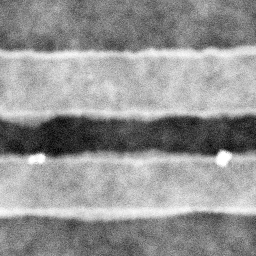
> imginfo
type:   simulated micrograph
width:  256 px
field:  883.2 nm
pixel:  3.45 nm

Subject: lines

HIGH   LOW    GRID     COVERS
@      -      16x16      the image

----------------
----------------
----------------
@@@@@@@@@@@@@@@@
@@@@@@@@@@@@@@@@
@@@@@@@@@@@@@@@@
@@@@@@@@@@@@@@@@
----------------
----------------
----------------
@@@@@@@@@@@@@@@@
@@@@@@@@@@@@@@@@
@@@@@@@@@@@@@@@@
----------------
----------------
----------------